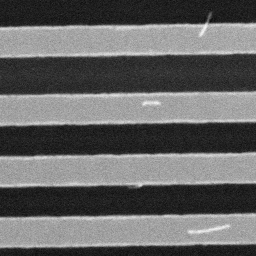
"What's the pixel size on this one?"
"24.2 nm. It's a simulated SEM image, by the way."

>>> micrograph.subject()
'lines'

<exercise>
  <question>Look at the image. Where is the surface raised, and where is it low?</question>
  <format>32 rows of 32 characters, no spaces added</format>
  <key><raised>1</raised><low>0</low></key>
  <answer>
00000000000000000000000000000000
00000000000000000000000000000000
00000000000000000000000000000000
11111111111111111111111111111111
11111111111111111111111111111111
11111111111111111111111111111111
11111111111111111111111111111111
00000000000000000000000000000000
00000000000000000000000000000000
00000000000000000000000000000000
00000000000000000000000000000000
00000000000000000000000000000011
11111111111111111111111111111111
11111111111111111111111111111111
11111111111111111111111111111111
11111111111000000000000000000000
00000000000000000000000000000000
00000000000000000000000000000000
00000000000000000000000000000000
00001111111111111111111111111111
11111111111111111111111111111111
11111111111111111111111111111111
11111111111111111111111111111111
00000000000000000000000000000000
00000000000000000000000000000000
00000000000000000000000000000000
00000000000000000000000000000000
11111111111111111111111111111111
11111111111111111111111111111111
11111111111111111111111111111111
11111111111111111111111111000000
00000000000000000000000000000000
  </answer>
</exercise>